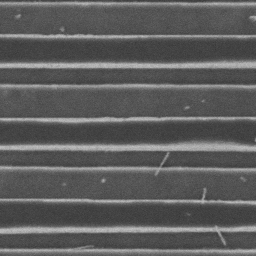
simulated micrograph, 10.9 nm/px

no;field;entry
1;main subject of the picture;lines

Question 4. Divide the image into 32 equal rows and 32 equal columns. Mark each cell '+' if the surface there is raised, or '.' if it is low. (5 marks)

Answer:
................................
................................
................................
................................
++++++++++++++++++++++++++++++++
++++++++++++++++++++++++++++++++
++++++++++++++++++++++++++++++++
++++++++++++++++++++++++++++++++
................................
................................
................................
................................
................................
................................
................................
++++++++++++++++++++++++++++++++
++++++++++++++++++++++++++++++++
++++++++++++++++++++++++++++++++
++++++++++++++++++++++++++++++++
................................
................................
................................
................................
................................
................................
++++++++++++++++++++++++++++++++
++++++++++++++++++++++++++++++++
++++++++++++++++++++++++++++++++
++++++++++++++++++++++++++++++++
................................
................................
................................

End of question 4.